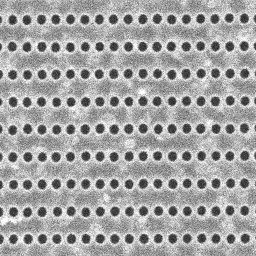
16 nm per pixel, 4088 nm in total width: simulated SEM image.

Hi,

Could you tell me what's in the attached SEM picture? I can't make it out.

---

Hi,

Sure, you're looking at a regular array of holes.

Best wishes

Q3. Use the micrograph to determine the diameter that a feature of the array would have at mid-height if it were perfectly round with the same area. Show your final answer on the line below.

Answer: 158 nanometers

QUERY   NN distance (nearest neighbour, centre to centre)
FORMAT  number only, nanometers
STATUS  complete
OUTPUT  227